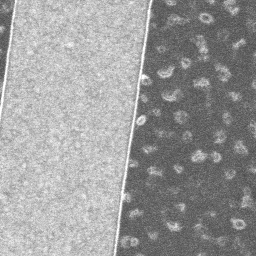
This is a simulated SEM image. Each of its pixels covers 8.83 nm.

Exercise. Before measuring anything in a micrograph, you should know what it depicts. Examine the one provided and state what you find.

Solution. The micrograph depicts one or a few lines or trenches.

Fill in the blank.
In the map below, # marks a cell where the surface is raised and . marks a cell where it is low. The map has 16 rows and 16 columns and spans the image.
#........#######
#........#######
#........#######
#........#######
.........#######
.........#######
.........#######
........########
........########
........########
........########
........########
........########
.......#########
.......#########
.......#########